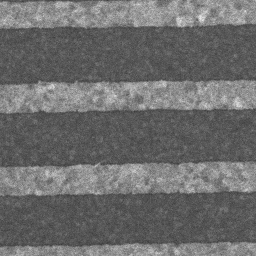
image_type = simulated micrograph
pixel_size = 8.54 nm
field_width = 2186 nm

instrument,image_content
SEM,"one or a few lines or trenches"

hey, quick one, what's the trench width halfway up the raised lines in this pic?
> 462 nm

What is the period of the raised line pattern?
0.701 µm